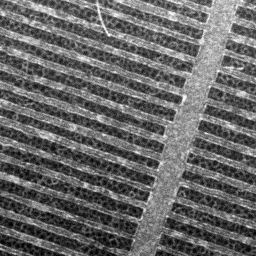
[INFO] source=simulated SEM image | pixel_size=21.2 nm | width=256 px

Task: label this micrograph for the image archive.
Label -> parallel lines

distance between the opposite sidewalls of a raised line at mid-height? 11.6 pixels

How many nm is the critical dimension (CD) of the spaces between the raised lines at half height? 111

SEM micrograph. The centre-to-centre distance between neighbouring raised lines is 363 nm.